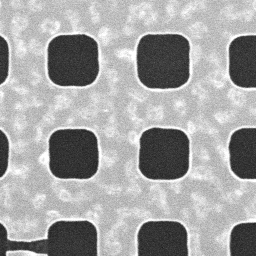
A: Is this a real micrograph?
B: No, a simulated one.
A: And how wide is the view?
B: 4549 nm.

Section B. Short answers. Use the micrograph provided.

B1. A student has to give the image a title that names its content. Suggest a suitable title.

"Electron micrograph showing holes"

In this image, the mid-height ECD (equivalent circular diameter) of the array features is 987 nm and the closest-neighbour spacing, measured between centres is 1.61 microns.